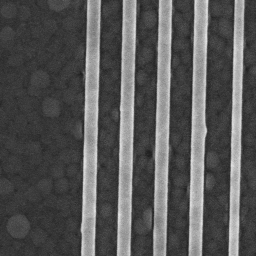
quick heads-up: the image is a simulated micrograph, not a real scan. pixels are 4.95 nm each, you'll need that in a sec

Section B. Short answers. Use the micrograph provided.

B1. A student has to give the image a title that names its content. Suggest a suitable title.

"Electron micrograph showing parallel lines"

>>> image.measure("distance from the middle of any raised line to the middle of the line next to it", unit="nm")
180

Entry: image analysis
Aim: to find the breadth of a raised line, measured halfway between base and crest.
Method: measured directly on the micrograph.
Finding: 63.7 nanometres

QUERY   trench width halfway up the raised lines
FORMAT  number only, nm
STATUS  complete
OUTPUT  111